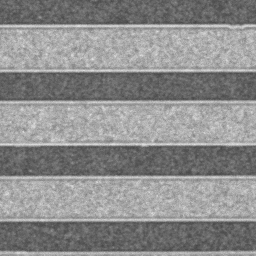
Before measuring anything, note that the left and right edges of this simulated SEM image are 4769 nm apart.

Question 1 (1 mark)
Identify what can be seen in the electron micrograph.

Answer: one or a few lines or trenches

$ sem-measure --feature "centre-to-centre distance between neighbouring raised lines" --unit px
75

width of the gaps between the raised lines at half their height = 622 nm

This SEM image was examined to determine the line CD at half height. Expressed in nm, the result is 794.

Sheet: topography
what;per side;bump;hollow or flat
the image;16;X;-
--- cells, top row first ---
----------------
----------------
XXXXXXXXXXXXXXXX
XXXXXXXXXXXXXXXX
----------------
----------------
XXXXXXXXXXXXXXXX
XXXXXXXXXXXXXXXX
XXXXXXXXXXXXXXXX
----------------
----------------
XXXXXXXXXXXXXXXX
XXXXXXXXXXXXXXXX
XXXXXXXXXXXXXXXX
----------------
----------------